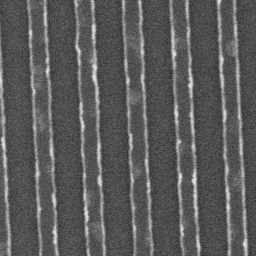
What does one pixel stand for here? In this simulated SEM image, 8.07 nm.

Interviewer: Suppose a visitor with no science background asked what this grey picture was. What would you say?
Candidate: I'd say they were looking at parallel lines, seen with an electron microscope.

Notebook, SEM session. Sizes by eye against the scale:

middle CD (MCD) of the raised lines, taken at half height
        141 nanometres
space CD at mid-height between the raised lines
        239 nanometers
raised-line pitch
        382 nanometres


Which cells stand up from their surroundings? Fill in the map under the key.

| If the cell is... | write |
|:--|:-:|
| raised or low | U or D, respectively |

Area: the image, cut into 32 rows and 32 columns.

DDDUUUDDDUUUDDDUUUDDDUUDDDDUUDDD
DDDDUUDDDUUUDDDUUUDDDUUDDDDUUDDD
DDDDUUDDDDUUDDDUUUDDDUUUDDDUUDDD
DDDDUUDDDDUUDDDUUUDDDUUUDDDUUUDD
DDDDUUDDDDUUDDDUUUDDDDUUDDDDUUDD
DDDDUUDDDDUUDDDDUUDDDDUUDDDDUUDD
DDDDUUDDDDUUDDDDUUDDDDUUDDDDUUDD
DDDDUUDDDDUUDDDDUUDDDDUUDDDDUUDD
DDDDUUDDDDUUDDDDUUDDDDUUDDDUUUDD
DDDDUUDDDDUUDDDDUUDDDDUUDDDDUUDD
DDDDUUDDDDUUDDDDUUDDDDUUDDDDUUDD
DDDDUUDDDDUUDDDDUUDDDDUUDDDDUUDD
DDDDUUDDDDUUDDDDUUDDDDUUDDDDUUDD
DDDDUUDDDDUUDDDDUUDDDDUUDDDDUUDD
DDDDUUDDDDUUDDDDUUDDDDUUDDDDUUDD
DDDDUUDDDDUUDDDDUUDDDDUUDDDDUUDD
UDDDUUDDDDUUDDDDUUDDDDUUDDDDUUDD
DDDDUUDDDDUUDDDDUUDDDDUUDDDDUUDD
UDDDUUDDDDUUDDDDUUDDDDUUDDDDUUDD
UDDDUUUDDDUUDDDDUUDDDDUUDDDDUUDD
UDDDDUUDDDUUUDDDUUDDDDUUDDDDUUDD
UDDDDUUDDDUUUDDDUUDDDDUUDDDDUUDD
UDDDDUUDDDUUUDDDUUUDDDUUUDDDUUDD
UDDDDUUDDDUUUDDDUUUDDDUUDDDDUUDD
UDDDDUUDDDDUUDDDUUUDDDUUUDDDUUDD
UDDDDUUDDDDUUDDDUUUDDDDUUDDDUUUD
UDDDDUUDDDDUUDDDDUUDDDDUUDDDDUUD
UDDDDUUDDDDUUDDDDUUDDDDUUDDDDUUD
UDDDDUUDDDDUUDDDDUUDDDDUUDDDDUUD
UDDDDUUDDDDUUDDDDUUDDDDUUDDDDUUD
UDDDDUUDDDDUUDDDDUUDDDDUUDDDDUUD
UDDDDUUDDDDUUDDDDUUDDDDUUDDDDUUD